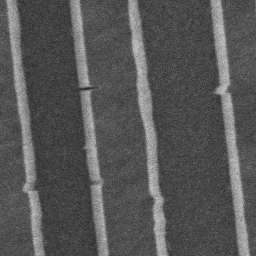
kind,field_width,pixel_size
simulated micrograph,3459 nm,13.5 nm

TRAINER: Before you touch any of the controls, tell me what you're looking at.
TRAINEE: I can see one or a few lines or trenches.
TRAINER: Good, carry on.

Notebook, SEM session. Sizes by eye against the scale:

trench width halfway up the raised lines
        936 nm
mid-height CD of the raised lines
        828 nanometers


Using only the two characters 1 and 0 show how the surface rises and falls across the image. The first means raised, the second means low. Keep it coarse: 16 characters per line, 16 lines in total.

1000011100000111
1000011100000011
1000011110000011
1000011110000011
1000011110000011
1000011110000011
1100011110000011
1100011110000011
1100001110000011
1100001111000011
1100001111000001
1100001111000001
1100001111000001
1100001111000001
1100001111000001
1100001111000001